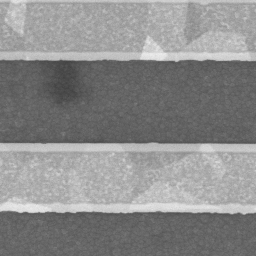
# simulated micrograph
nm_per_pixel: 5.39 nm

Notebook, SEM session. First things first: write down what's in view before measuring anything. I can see one or a few lines or trenches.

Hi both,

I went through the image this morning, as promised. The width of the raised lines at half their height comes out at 0.338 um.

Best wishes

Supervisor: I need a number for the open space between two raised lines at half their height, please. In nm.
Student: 483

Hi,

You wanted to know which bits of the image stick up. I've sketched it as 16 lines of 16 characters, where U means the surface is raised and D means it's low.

UUUUUUUUUUUUUUUU
UUUUUUUUUUUUUUUU
UUUUUUUUUUUUUUUU
UDDUUUUUUUUUUUUU
DDDDDDDDDDDDDDDD
DDDDDDDDDDDDDDDD
DDDDDDDDDDDDDDDD
DDDDDDDDDDDDDDDD
DDDDDDDDDDDDDDDD
UUUUUUUUUUUUUUUU
UUUUUUUUUUUUUUUU
UUUUUUUUUUUUUUUU
UUUUUUUUUUUUUUUU
DDDDDDDDDDDDDDDD
DDDDDDDDDDDDDDDD
DDDDDDDDDDDDDDDD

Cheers